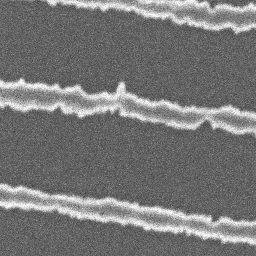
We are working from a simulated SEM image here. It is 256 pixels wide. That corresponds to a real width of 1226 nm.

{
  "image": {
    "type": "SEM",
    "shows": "one or a few lines or trenches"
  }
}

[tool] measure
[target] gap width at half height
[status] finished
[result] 0.416 µm